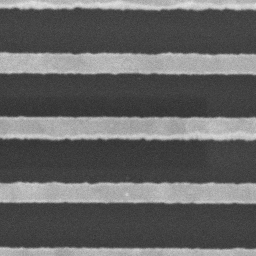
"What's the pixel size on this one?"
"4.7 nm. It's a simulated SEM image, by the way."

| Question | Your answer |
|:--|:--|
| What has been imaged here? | lines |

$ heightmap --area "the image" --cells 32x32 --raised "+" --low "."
++++++++++++++++++++++++++++++++
................................
................................
................................
................................
................................
................................
++++++++++++++++++++++++++++++++
++++++++++++++++++++++++++++++++
................................
................................
................................
................................
................................
................................
++++++++++++++++++++++++++++++++
++++++++++++++++++++++++++++++++
................................
................................
................................
................................
................................
................................
++++++++++++++++++++++++++++++++
++++++++++++++++++++++++++++++++
................................
................................
................................
................................
................................
................................
++++++++++++++++++++++++++++++++